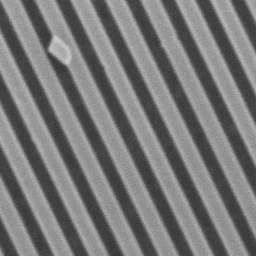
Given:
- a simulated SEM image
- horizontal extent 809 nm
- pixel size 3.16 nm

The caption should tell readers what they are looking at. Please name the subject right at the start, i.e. parallel lines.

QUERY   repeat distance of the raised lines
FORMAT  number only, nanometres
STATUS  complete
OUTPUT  99.6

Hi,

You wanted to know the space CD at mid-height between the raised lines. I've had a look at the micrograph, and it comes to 0.048 microns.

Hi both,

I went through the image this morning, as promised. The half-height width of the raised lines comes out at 50.8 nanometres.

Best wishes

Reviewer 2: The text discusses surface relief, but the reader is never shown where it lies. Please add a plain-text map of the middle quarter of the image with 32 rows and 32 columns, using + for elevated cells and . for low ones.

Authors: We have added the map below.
.+++++....++++.....++++....+++++
.+++++....+++++....+++++....++++
..++++.....++++.....++++....++++
..+++++....+++++....+++++....+++
...++++.....++++....+++++....+++
...+++++....+++++....+++++....++
....++++.....++++....+++++....++
....+++++....+++++....+++++....+
.....++++.....++++....+++++....+
+....+++++....+++++....++++.....
+.....++++.....++++....+++++....
++....+++++....+++++....++++....
++.....++++.....++++....+++++...
+++....+++++....++++.....++++...
+++.....++++.....++++....+++++..
++++....+++++....++++.....++++..
+++++....++++.....++++....+++++.
+++++....+++++....++++.....++++.
.++++.....++++.....++++....+++++
.+++++....+++++....++++.....++++
..++++.....++++.....++++....++++
..+++++....+++++....++++.....+++
...++++.....++++....+++++....+++
...+++++....+++++....++++.....++
....++++.....++++....+++++....++
....+++++....+++++....++++.....+
.....++++.....++++....+++++....+
+....+++++....+++++....++++.....
+.....++++....+++++....+++++....
++....+++++....+++++....++++....
++.....++++....+++++....+++++...
+++....+++++....+++++....++++...